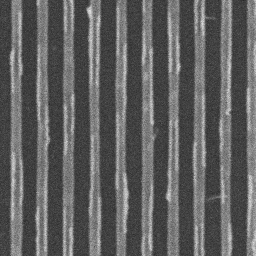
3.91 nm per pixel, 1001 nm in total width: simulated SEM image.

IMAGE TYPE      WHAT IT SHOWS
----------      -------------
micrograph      parallel lines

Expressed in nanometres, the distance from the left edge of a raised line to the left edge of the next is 103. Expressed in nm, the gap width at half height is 63.1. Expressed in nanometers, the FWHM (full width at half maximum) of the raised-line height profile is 39.1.